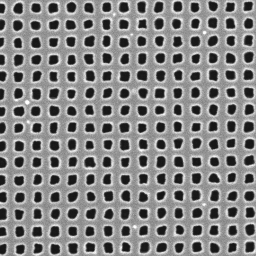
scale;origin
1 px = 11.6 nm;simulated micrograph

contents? a regular array of holes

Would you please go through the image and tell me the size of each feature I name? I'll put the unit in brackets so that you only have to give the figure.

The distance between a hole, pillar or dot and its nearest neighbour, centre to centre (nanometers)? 194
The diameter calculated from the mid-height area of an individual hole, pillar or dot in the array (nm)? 115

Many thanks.